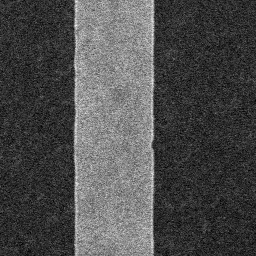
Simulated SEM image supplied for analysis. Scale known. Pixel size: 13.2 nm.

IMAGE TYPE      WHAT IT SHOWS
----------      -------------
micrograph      one or a few lines or trenches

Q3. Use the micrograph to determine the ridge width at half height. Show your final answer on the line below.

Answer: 76.2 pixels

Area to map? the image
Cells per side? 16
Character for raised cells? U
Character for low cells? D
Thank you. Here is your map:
DDDDDUUUUUDDDDDD
DDDDDUUUUUDDDDDD
DDDDDUUUUUDDDDDD
DDDDDUUUUDDDDDDD
DDDDDUUUUUDDDDDD
DDDDDUUUUDDDDDDD
DDDDDUUUUDDDDDDD
DDDDDUUUUDDDDDDD
DDDDDUUUUDDDDDDD
DDDDDUUUUDDDDDDD
DDDDDUUUUUDDDDDD
DDDDDUUUUDDDDDDD
DDDDDUUUUDDDDDDD
DDDDDUUUUDDDDDDD
DDDDDUUUUDDDDDDD
DDDDDUUUUUDDDDDD